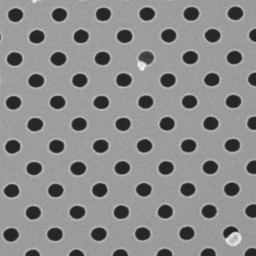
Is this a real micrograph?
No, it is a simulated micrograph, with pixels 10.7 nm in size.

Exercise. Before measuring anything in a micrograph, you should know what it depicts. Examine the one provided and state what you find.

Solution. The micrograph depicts a regular array of holes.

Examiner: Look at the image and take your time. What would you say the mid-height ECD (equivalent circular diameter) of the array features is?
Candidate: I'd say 0.154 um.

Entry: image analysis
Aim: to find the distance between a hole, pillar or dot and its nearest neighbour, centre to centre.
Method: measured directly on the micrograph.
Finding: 327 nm